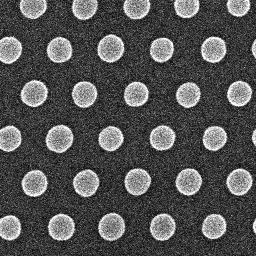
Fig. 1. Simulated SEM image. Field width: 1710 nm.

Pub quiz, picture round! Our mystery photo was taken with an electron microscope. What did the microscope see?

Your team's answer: a regular array of raised bodies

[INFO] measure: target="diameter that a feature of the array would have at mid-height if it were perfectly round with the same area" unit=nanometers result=163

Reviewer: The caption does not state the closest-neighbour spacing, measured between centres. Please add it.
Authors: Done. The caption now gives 338 nm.